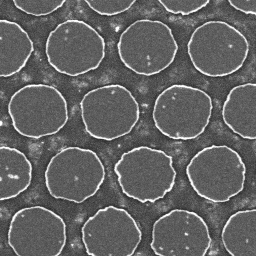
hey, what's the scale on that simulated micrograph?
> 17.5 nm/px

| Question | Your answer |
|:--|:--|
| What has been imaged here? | a regular array of raised bodies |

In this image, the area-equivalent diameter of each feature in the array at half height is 977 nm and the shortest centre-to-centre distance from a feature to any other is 1240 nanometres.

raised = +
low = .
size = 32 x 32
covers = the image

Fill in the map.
..++++++...++++++...++++++...+++
...+++......+++.......++.......+
................................
+++....++++.....+++++....++++...
+++...++++++...+++++++..++++++..
++++..+++++++..+++++++..+++++++.
++++..+++++++..+++++++..+++++++.
+++...+++++++..+++++++..+++++++.
+++....+++++....+++++....+++++..
+...............................
...............................+
..+++++....+++++....+++++....+++
.+++++++..+++++++...++++++..++++
.+++++++..+++++++..+++++++..++++
.+++++++..+++++++..+++++++..++++
..++++++...++++++...++++++..++++
..+++++....+++++....+++++....+++
................................
+........+.......++.......+++...
+++....+++++...++++++...++++++..
++++..+++++++..++++++...++++++..
++++..+++++++..+++++++.++++++++.
++++..+++++++..+++++++..++++++..
+++...++++++...++++++...++++++..
++.....++++.....++++.....++++...
................................
..++++......++++.....+++......++
..++++++...++++++...+++++....+++
.+++++++..+++++++..+++++++..++++
.+++++++..++++++++.+++++++..++++
.+++++++...++++++..+++++++..++++
..++++++...++++++..+++++++...+++